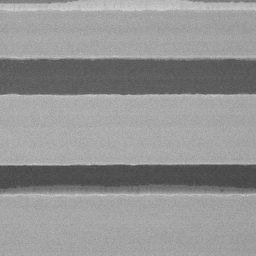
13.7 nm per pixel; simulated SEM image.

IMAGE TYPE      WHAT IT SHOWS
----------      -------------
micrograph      lines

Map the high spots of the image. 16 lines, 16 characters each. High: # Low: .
################
################
################
################
................
................
################
################
################
################
................
................
################
################
################
################